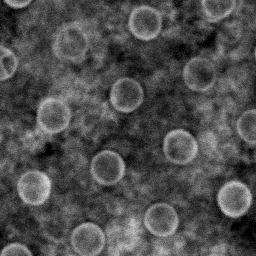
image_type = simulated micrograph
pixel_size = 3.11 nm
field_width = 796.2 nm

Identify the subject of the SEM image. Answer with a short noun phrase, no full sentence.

a regular array of raised bodies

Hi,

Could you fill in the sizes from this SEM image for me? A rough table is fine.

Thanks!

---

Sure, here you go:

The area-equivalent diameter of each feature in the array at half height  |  102 nm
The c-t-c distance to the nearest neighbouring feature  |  74.8 px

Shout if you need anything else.